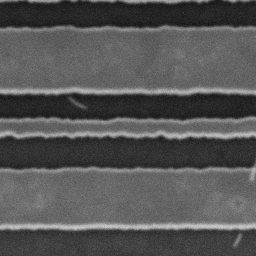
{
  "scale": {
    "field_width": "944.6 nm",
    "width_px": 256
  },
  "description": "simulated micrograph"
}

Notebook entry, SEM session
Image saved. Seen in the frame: lines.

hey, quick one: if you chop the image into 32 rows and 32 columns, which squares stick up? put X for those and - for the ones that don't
--------------------------------
--------------------------------
--------------------------------
-X-X--XXXX-XXXX---XXXXXXXXXXX-XX
XXXXXXXXXXXXXXXXXXXXXXXXXXXXXXXX
XXXXXXXXXXXXXXXXXXXXXXXXXXXXXXXX
XXXXXXXXXXXXXXXXXXXXXXXXXXXXXXXX
XXXXXXXXXXXXXXXXXXXXXXXXXXXXXXXX
XXXXXXXXXXXXXXXXXXXXXXXXXXXXXXXX
XXXXXXXXXXXXXXXXXXXXXXXXXXXXXXXX
XXXXXXXXXXXXXXXXXXXXXXXXXXXXXXXX
XXXXXXXXXXXXXXXXXXXXXXXXXXXXXXXX
--------------------------------
--------------------------------
--------------------------------
XXXXXXXXXXXXXXXXXXXXXXXXXXXXXXXX
XXXXXXXXXXXXXXXXXXXXXXXXXXXXXXXX
--------------------------------
--------------------------------
--------------------------------
--------------------------------
XXXXXXXXXXXXXXXXXXXXXXXXXXXXXXXX
XXXXXXXXXXXXXXXXXXXXXXXXXXXXXXXX
XXXXXXXXXXXXXXXXXXXXXXXXXXXXXXXX
XXXXXXXXXXXXXXXXXXXXXXXXXXXXXXXX
XXXXXXXXXXXXXXXXXXXXXXXXXXXXXXXX
XXXXXXXXXXXXXXXXXXXXXXXXXXXXXXXX
XXXXXXXXXXXXXXXXXXXXXXXXXXXXXXXX
XXXXXXXXXXXX---XXXXXXXX-XX-XXXX-
--------------------------------
--------------------------------
--------------------------------